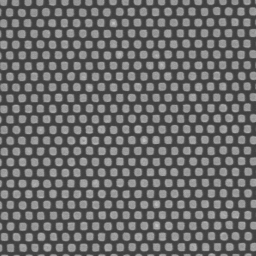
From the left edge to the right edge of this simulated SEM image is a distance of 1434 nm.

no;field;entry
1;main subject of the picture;a regular array of raised bodies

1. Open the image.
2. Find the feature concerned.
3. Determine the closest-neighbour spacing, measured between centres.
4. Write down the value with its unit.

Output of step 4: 11.9 px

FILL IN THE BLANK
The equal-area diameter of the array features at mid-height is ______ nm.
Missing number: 45.5